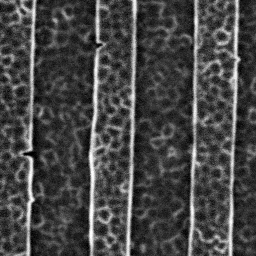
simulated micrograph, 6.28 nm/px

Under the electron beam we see one or a few lines or trenches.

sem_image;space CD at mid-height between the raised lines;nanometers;384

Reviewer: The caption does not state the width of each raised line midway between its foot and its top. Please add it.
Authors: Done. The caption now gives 252 nm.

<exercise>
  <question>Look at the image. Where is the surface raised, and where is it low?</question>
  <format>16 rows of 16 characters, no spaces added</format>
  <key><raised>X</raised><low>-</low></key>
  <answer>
XX----XX----XXX-
XX----XX----XXX-
XX----XX----XXX-
XX----XX----XXX-
XX----XX----XXX-
XX----XX----XXX-
XX----XX----XXX-
XX----XX----XXX-
XX----XX----XXX-
XX----XX----XXX-
XX----XX----XXX-
XX----XX----XXX-
XX----XX----XX--
XX----XX----XX--
XX----XX----XX--
XX----XX----XX--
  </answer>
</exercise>